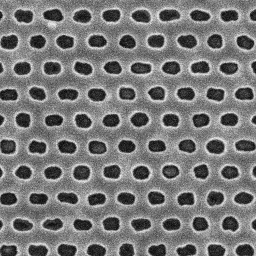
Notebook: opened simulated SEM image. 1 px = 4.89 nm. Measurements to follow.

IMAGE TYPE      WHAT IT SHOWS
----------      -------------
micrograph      a regular array of holes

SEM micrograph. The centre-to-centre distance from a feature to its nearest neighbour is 0.14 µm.